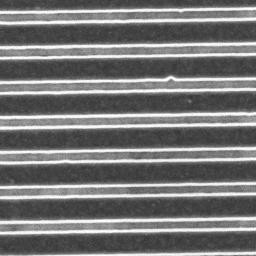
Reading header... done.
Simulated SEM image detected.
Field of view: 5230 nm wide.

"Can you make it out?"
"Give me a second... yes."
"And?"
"parallel lines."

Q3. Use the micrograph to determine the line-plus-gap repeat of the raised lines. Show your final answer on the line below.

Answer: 0.714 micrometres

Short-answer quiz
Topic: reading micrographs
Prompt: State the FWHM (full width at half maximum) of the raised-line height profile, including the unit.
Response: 24.6 pixels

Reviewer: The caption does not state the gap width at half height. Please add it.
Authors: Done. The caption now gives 9.87 pixels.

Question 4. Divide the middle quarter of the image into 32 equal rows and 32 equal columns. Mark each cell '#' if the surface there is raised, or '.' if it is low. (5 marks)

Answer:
################################
################################
################################
##########################.#####
................................
................................
................................
################################
################################
################################
################################
################################
################################
................................
................................
....................############
################################
################################
################################
################################
################################
#############....##..##.#.......
................................
................................
##..###..#######################
################################
################################
################################
################################
################################
##..............................
................................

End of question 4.